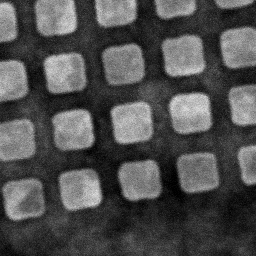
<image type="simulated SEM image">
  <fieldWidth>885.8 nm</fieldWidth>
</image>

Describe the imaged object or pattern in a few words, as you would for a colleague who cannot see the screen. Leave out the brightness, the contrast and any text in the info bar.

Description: a regular array of raised bodies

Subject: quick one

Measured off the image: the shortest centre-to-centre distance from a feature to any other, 200 nm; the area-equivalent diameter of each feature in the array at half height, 144 nm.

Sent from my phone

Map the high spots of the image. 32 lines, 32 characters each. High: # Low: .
#...#####...#####...####...####.
##..#####...#####...####........
##...####...#####...............
##...####.......................
##..........................####
....................#####...####
.............#####..#####...####
......####...#####...####...####
###...#####..#####...####.......
###...#####..#####..............
###...#####...#.................
###....#.....................###
#.....................####...###
..............#####..#####...###
.......####...#####..#####...###
####...####...#####...####......
####...#####..#####...##........
####...#####...###..............
####...###.....................#
####...................####...##
................###...#####...##
.........###...#####..#####...##
...##..#####...#####..#####...##
.####...####...#####...####.....
.####...#####...###.............
.#####..####....................
.####...........................
................................
................................
................................
................................
................................